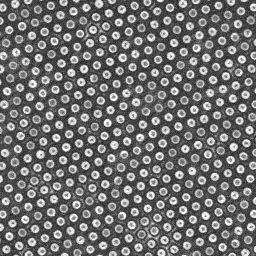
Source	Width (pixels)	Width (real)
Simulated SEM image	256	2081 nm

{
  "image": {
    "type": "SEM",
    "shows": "a regular array of raised bodies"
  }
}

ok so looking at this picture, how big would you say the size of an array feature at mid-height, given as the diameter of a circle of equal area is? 0.0601 microns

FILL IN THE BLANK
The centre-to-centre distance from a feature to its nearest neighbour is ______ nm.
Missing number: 107